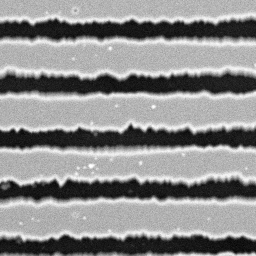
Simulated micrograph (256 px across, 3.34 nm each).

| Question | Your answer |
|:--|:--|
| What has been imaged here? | lines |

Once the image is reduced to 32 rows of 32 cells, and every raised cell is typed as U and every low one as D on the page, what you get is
UUUUUUUUUUUUUUUUUUUUUUUUUUUUUUUU
UUUUUUUUUUUUUUUUUUUUUUUUUUUUUUUU
UUUUUUDUUUUUUUUUUUUUUUUUUUUUUDDD
DDDDDDDDDDDDDDDDDDDDDDDDDDDDDDDD
DDDDDDDDDDDDDDDDDDDDDDDDDDDDDDDD
UUUUUUUUUUUUUUUUUUUUUUUUUUUUUUUU
UUUUUUUUUUUUUUUUUUUUUUUUUUUUUUUU
UUUUUUUUUUUUUUUUUUUUUUUUUUUUUUUU
UUUUUUUUUUUUUUUUUUUUUUUUUUUUUUUU
DDDUUDUDUUUUDDUUDDUUUDDDDDDDDDDD
DDDDDDDDDDDDDDDDDDDDDDDDDDDDDDDD
DDDDDDDDDDDDDDDDDDDDDDDDDUDDDDDU
UUUUUUUUUUUUUUUUUUUUUUUUUUUUUUUU
UUUUUUUUUUUUUUUUUUUUUUUUUUUUUUUU
UUUUUUUUUUUUUUUUUUUUUUUUUUUUUUUU
UUUUUUUUUUUUUUUUUUUUUUUUUUUUUUUU
DDDDDDDDDDDDDDDDDDDDDDDDUDDDDDDD
DDDDDDDDDDDDDDDDDDDDDDDDDDDDDDDD
UDDDUUUDDDDDDDDDDDUUUUUUUUUUUUUU
UUUUUUUUUUUUUUUUUUUUUUUUUUUUUUUU
UUUUUUUUUUUUUUUUUUUUUUUUUUUUUUUU
UUUUUUUUUUUUUUUUUUUUUUUUUUUUUUUU
UUUUUUUUDUUUUUUUDUUUUUUUUUDDDDUU
DDDDDDDDDDDDDDDDDDDDDDDDDDDDDDDD
DDDDDDDDDDDDDDDDDDDDDDDDDDDDDDDD
UUUUUUUUUUUUUUUUUUUUUUUUUUUUUUUU
UUUUUUUUUUUUUUUUUUUUUUUUUUUUUUUU
UUUUUUUUUUUUUUUUUUUUUUUUUUUUUUUU
UUUUUUUUUUUUUUUUUUUUUUUUUUUUUUUU
UUUUUUUUDUUUUUUUDDUUUUUUDUUUUUUU
DDDDDDDDDDDDDDDDDDDDDDDDDDDDDDDD
DDDDDDDDDDDDDDDDDDDDDDDDDDDDUDDD